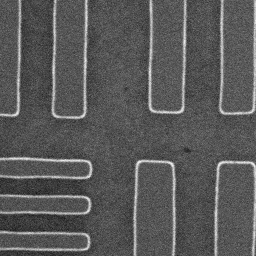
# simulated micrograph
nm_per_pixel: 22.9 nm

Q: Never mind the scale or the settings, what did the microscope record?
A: groups of lines, slits or small figures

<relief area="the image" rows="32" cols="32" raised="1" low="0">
11000001111000000001111000001111
11100001111000000001111000001111
11100001111000000001111000001111
11000001111000000001111000001111
11000001111000000001111000001111
11000001111000000001111000001111
11000001111000000001111000001111
11000001111000000001111000001111
11000001111000000001111000001111
11000001111000000001111000001111
11000001111000000001111000001111
11000001111000000001111000001111
11000001111000000001111000001111
11000001111000000001111000001111
00000001110000000000000000000000
00000000000000000000000000000000
00000000000000000000000000000000
00000000000000000000000000000000
00000000000000000000000000000000
00000000000000000000000000000000
11111111111000000111100000001111
11111111111000000111110000011111
00000000000000000111110000011111
00000000000000000111110000011111
00000000000000000111110000011111
11111111111000000111110000011111
11111111111000000111110000011111
00000000000000000111110000011111
00000000000000000111110000011111
11111111111000000111110000011111
11111111111000000111110000011111
00000000000000000111110000011111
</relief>